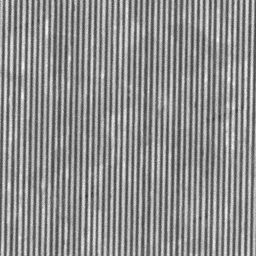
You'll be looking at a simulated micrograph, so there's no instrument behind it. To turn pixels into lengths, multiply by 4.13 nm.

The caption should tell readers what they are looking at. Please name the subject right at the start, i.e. parallel lines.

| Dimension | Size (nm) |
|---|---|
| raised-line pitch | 23.6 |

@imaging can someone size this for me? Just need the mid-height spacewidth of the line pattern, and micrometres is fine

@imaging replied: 0.0139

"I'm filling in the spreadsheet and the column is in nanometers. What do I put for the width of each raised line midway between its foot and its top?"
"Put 9.3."